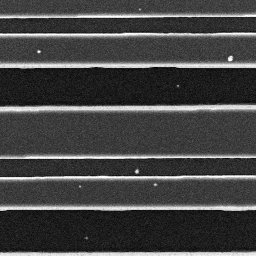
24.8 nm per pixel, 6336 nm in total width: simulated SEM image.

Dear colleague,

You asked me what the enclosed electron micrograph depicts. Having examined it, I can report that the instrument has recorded lines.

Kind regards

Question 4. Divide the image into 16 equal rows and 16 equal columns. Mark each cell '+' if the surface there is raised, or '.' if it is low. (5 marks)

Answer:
++++++++++++++++
++++++++++++++++
++++++++++++++++
++++++++++++++++
................
................
................
++++++++++++++++
++++++++++++++++
++++++++++++++++
++++++++++++++++
++++++++++++++++
++++++++++++++++
................
................
................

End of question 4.